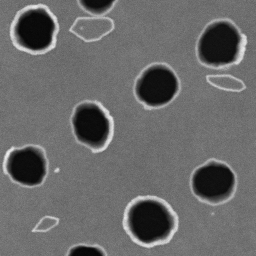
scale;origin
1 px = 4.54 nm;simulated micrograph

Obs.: holes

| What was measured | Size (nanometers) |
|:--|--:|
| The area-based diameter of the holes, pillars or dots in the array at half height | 176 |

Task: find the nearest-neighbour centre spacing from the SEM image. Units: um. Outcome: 0.34